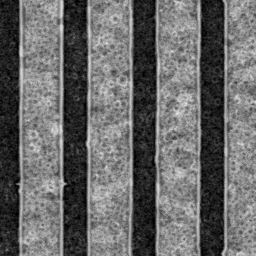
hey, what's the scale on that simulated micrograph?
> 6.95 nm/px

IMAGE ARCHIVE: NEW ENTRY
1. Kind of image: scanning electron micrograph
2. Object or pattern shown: one or a few lines or trenches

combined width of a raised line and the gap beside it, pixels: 68.4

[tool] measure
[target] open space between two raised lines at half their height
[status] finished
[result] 0.191 micrometres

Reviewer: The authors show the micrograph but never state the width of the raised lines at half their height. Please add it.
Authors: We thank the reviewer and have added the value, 286 nanometres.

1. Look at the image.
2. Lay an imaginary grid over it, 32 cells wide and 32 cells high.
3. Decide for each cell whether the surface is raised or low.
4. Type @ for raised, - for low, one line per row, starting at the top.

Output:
---@@@@@---@@@@@----@@@@@---@@@@
---@@@@@---@@@@@----@@@@@---@@@@
---@@@@@---@@@@@----@@@@@---@@@@
---@@@@@---@@@@@----@@@@@---@@@@
---@@@@@---@@@@@----@@@@@---@@@@
---@@@@@---@@@@@----@@@@@---@@@@
---@@@@@---@@@@@----@@@@@---@@@@
---@@@@@---@@@@@----@@@@@---@@@@
---@@@@@---@@@@@----@@@@@---@@@@
---@@@@@---@@@@@----@@@@@---@@@@
---@@@@@---@@@@@----@@@@@---@@@@
---@@@@@---@@@@@----@@@@@---@@@@
---@@@@@---@@@@@----@@@@@---@@@@
---@@@@@---@@@@@----@@@@@---@@@@
---@@@@@---@@@@@----@@@@@---@@@@
---@@@@@---@@@@@----@@@@@---@@@@
---@@@@@---@@@@@----@@@@@---@@@@
---@@@@@---@@@@@----@@@@@---@@@@
---@@@@@---@@@@@----@@@@@---@@@@
---@@@@@---@@@@@----@@@@@---@@@@
---@@@@@---@@@@@----@@@@@---@@@@
---@@@@@---@@@@@----@@@@@---@@@@
---@@@@@---@@@@@----@@@@@---@@@@
---@@@@@---@@@@@----@@@@@---@@@@
---@@@@@---@@@@@----@@@@@---@@@@
---@@@@@---@@@@@----@@@@@---@@@@
---@@@@@---@@@@@----@@@@@---@@@@
---@@@@@---@@@@@----@@@@@---@@@@
---@@@@@---@@@@@----@@@@@---@@@@
---@@@@@---@@@@@----@@@@@---@@@@
---@@@@@---@@@@@----@@@@@---@@@@
---@@@@@---@@@@@----@@@@@---@@@@